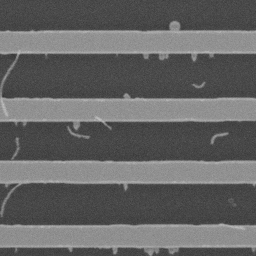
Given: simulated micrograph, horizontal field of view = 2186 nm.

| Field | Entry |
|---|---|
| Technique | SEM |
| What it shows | lines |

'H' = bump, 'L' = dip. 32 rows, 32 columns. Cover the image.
LLLLLLLLLLLLLLLLLLLLLLLLLLLLLLLL
LLLLLLLLLLLLLLLLLLLLLLLLLLLLLLLL
LLLLLLLLLLLLLLLLLLLLLLLLLLLLLLLL
LLLLLLLLLLLLLLLLLLLLLLLLLLLLLLLL
HHHHHHHHHHHHHHHHHHHHHHHHHHHHHHHH
HHHHHHHHHHHHHHHHHHHHHHHHHHHHHHHH
HHHHHHHHHHHHHHHHHHHHHHHHHHHHHHHH
LLLLLLLLLLLLLLLLLLLLLLLLLLLLLLLL
LLLLLLLLLLLLLLLLLLLLLLLLLLLLLLLL
LLLLLLLLLLLLLLLLLLLLLLLLLLLLLLLL
LLLLLLLLLLLLLLLLLLLLLLLLLLLLLLLL
LLLLLLLLLLLLLLLLLLLLLLLLLLLLLLLL
HHHHHHHHHHHHHHHHHHHHHHHHHHHHHHHH
HHHHHHHHHHHHHHHHHHHHHHHHHHHHHHHH
HHHHHHHHHHHHHHHHHHHHHHHHHHHHHHHH
LLLLLLLLLLLLLLLLLLLLLLLLLLLLLLLL
LLLLLLLLLLLLLLLLLLLLLLLLLLLLLLLL
LLLLLLLLLLLLLLLLLLLLLLLLLLLLLLLL
LLLLLLLLLLLLLLLLLLLLLLLLLLLLLLLL
LLLLLLLLLLLLLLLLLLLLLLLLLLLLLLLL
HHHHHHHHHHHHHHHHHHHHHHHHHHHHHHHH
HHHHHHHHHHHHHHHHHHHHHHHHHHHHHHHH
HHHHHHHHHHHHHHHHHHHHHHHHHHHHHHHH
LLLLLLLLLLLLLLLLLLLLLLLLLLLLLLLL
LLLLLLLLLLLLLLLLLLLLLLLLLLLLLLLL
LLLLLLLLLLLLLLLLLLLLLLLLLLLLLLLL
LLLLLLLLLLLLLLLLLLLLLLLLLLLLLLLL
LLLLLLLLLLLLLLLLLLLLLLLLLLLLLLLL
HHHHHHHHHHHHHHHHHHHHHHHHHHHHHHHH
HHHHHHHHHHHHHHHHHHHHHHHHHHHHHHHH
HHHHHHHHHHHHHHHHHHHHHHHHHHHHHHHH
LLLLLLLLLLLLLLLLLLLLLLLLLLLLLLLL